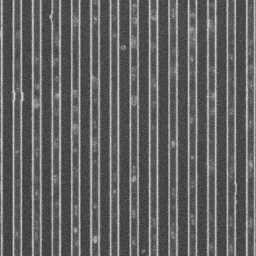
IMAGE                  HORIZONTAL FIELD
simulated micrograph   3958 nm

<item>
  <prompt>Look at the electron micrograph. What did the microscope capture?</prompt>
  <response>parallel lines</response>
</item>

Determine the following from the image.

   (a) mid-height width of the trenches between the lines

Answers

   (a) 178 nanometers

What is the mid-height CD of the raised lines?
131 nanometres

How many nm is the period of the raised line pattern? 301